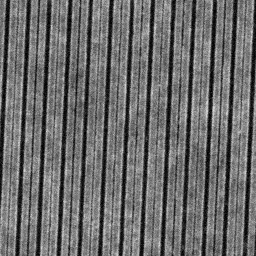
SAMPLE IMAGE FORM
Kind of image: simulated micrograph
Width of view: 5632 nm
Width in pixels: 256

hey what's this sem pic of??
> parallel lines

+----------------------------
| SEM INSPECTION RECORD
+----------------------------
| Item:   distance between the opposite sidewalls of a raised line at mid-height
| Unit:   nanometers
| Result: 146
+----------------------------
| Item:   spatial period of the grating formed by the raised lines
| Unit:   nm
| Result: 226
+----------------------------